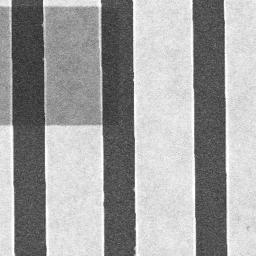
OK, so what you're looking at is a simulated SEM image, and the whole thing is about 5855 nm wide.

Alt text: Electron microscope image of lines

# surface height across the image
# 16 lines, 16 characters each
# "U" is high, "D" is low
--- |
UDDUUUDDUUUUDDUU
UDDUUUDDUUUUDDUU
UDDUUUDDUUUUDDUU
UDDUUUDDUUUUDDUU
UDDUUUDDUUUUDDUU
UDDUUUDDUUUUDDUU
UDDUUUDDUUUUDDUU
UDDUUUDDUUUUDDUU
UDDUUUDDUUUUDDUU
UDDUUUDDUUUUDDUU
UDDUUUDDUUUUDDUU
UDDUUUDDUUUUDDUU
UDDUUUDDUUUUDDUU
UDDUUUDDDUUUDDUU
UDDUUUDDDUUUDDUU
UDDUUUDDDUUUDDUU